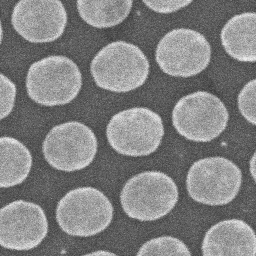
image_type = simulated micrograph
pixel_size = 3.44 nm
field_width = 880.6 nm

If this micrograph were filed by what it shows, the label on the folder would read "a regular array of raised bodies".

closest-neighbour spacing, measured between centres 225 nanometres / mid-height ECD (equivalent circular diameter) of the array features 51.4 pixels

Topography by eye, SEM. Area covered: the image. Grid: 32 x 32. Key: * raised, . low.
..******..******..*****.........
..******..******................
..******...****..............***
..******....................****
...****..............****...****
..............**....******..****
............******..******..****
.....****...******..******....**
....******.*******..******......
...*******..******..............
**.*******..******.............*
**..******....................**
**..*****..............****...**
*.....................******..**
*..............*****..******...*
........**....******..******....
......*****..*******..******....
**....******..******....**......
***..*******..*****.............
****..******....................
****..*****.............*****..*
****....................******.*
***.............*****..*******..
...............*******.*******..
........*****..*******..*****...
.***...*******.*******....**....
*****..*******..*****...........
******.*******....*.............
******..*****..............****.
******....*...............******
*****.............*****..*******
............*....*******.*******